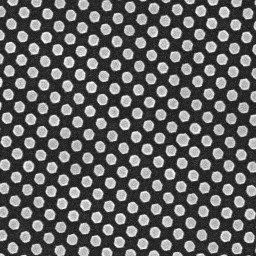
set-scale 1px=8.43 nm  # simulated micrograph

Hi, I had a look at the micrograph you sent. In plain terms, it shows a regular array of raised bodies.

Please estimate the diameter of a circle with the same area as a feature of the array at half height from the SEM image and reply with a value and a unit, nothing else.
89.2 nm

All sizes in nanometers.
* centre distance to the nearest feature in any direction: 139